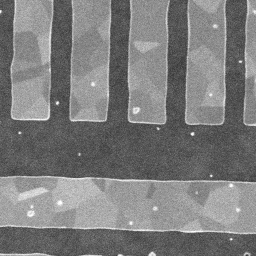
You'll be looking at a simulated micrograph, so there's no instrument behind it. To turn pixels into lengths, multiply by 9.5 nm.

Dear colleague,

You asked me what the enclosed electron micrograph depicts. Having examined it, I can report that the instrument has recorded groups of lines, slits or small figures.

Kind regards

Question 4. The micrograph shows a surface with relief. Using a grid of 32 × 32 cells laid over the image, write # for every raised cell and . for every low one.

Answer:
..#####..#####..#####...####...#
..#####..#####..#####...####...#
..####...#####..#####...####...#
..####...#####..#####...####...#
..####...#####..#####...####...#
..####...#####..#####...####...#
..####...#####..#####...####...#
..####...#####..#####...####...#
.#####...#####..#####..#####...#
.#####...#####..#####..#####...#
.#####...#####..#####..#####...#
..####...#####..#####..#####...#
..####...#####..#####..#####...#
.#####...####...#####..#####...#
..####...####...#####..#####...#
........................####...#
................................
................................
................................
................................
................................
................................
###############.................
################################
################################
################################
################################
################################
.........###.###################
................................
................................
................................